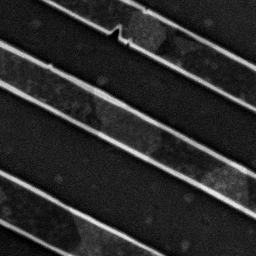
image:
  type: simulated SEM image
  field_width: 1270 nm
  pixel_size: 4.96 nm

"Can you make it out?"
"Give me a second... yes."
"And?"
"one or a few lines or trenches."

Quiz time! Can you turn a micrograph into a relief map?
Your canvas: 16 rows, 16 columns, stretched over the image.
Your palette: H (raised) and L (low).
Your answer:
LLLLHHHHHLLLLLLL
LLLLLLHHHHHLLLLL
LLLLLLLLHHHHHLLL
HHLLLLLLLLHHHHHL
HHHHLLLLLLLLHHHH
LHHHHHLLLLLLLHHH
LLLHHHHLLLLLLLLH
LLLLHHHHHLLLLLLL
LLLLLLHHHHHLLLLL
LLLLLLLLHHHHHLLL
LLLLLLLLLLHHHHHL
HLLLLLLLLLLLHHHH
HHHLLLLLLLLLLLHH
HHHHHLLLLLLLLLLL
LHHHHHHLLLLLLLLL
LLLHHHHHHLLLLLLL